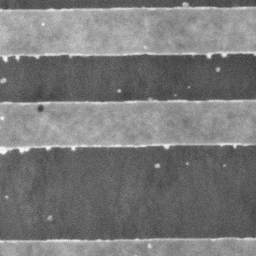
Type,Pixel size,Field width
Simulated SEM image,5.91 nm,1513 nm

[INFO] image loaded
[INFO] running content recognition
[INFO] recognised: lines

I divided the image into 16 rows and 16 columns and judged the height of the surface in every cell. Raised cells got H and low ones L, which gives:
LLLLLLLLLLHHHHHH
HHHHHHHHHHHHHHHH
HHHHHHHHHHHHHHHH
LLLLLLLLLLLLLLLL
LLLLLLLLLLLLLLLL
LLLLLLLLLLLLLLLL
HHHHHHHHHHHHHHHH
HHHHHHHHHHHHHHHH
HHHHHHHHHHHHHHHH
LLLLLLLLLLLLLLLL
LLLLLLLLLLLLLLLL
LLLLLLLLLLLLLLLL
LLLLLLLLLLLLLLLL
LLLLLLLLLLLLLLLL
LLLLLLLLLLLLLLLL
HHHHHHHHHHHHHHHH